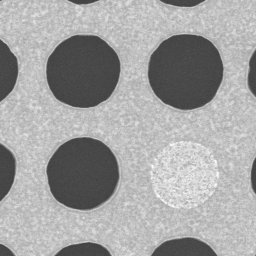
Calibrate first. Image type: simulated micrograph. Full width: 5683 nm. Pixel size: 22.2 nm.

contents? holes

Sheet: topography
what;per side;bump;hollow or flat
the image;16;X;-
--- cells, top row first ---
XXXXXXXXXXXXXXXX
XXXXXXXXXXXXXXXX
XXXX--XXXX---XXX
-XX----XX-----XX
-XX-----X-----XX
-XX----XX-----XX
XXXX--XXXX---XXX
XXXXXXXXXXXXXXXX
XXXXXXXXXXXXXXXX
-XX----XXXXXXXXX
-XX----XXXXXXXXX
-XX----XXXXXXXXX
XXXX---XXXXXXXXX
XXXXXXXXXXXXXXXX
XXXXXXXXXXXXXXXX
XXXX---XXX---XXX